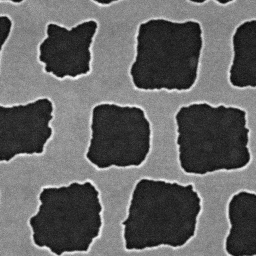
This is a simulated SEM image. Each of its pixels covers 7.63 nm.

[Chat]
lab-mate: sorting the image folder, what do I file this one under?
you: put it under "holes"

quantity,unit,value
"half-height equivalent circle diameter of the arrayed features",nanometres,569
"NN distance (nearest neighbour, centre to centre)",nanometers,701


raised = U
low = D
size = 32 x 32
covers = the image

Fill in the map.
UUUUUUUUUUUUUDUUUUUUUUUUUUUUUUUU
UUUUUUUUUUUUUUUUUUUUUUUUUUUUUUUU
DUUUUUUUUUUUUUUUUUUDDUUUUUUUUUUU
DUUUUUDDUDDDUUUUUDDDDDDDDUUUUUDD
DUUUUUDDDDDDUUUUUDDDDDDDDUUUUDDD
UUUUUDDDDDDUUUUUUDDDDDDDDUUUUDDD
UUUUUDDDDDDUUUUUUDDDDDDDDUUUUDDD
UUUUUDDDDDDUUUUUUDDDDDDDDUUUUDDD
UUUUUUDDDDDUUUUUDDDDDDDDDUUUUDDD
UUUUUUUDDDUUUUUUDDDDDDDDDUUUUDDD
UUUUUUUUUUUUUUUUUDDDDDDDUUUUUDDD
UUUUUUUUUUUUUUUUUUUUUUUUUUUUUUUU
UUUUUDUUUUUUUUUUUUUUUUUUUUUUUUUU
DDDDDDDUUUUUDDDDDUUUUUUDDDDDDDUU
DDDDDDUUUUUUDDDDDDUUUUDDDDDDDDDU
DDDDDDUUUUUDDDDDDDDUUUDDDDDDDDDU
DDDDDDDUUUUDDDDDDDDUUUDDDDDDDDDU
DDDDDDUUUUUDDDDDDDDUUUDDDDDDDDDU
DDDDDUUUUUUDDDDDDDDUUUDDDDDDDDDU
DDUUUUUUUUUDDDDDDDUUUUDDDDDDDDDU
UUUUUUUUUUUUDDDDDDUUUUUDDDDDDDDU
UUUUUUUUUUUUUUUUUUUUUUUDDDUUUUUU
UUUUUUUUUUUUUUUUUUDUUUUUUUUUUUUU
UUUUUUDDDDDDUUUUUDDDDDDDUUUUUUUU
UUUUUDDDDDDDUUUUDDDDDDDDDUUUUDDD
UUUUUDDDDDDDDUUUDDDDDDDDDUUUUDDD
UUUUUDDDDDDDDUUUDDDDDDDDDUUUDDDD
UUUUDDDDDDDDDUUUDDDDDDDDDUUUUDDD
UUUUDDDDDDDDDUUDDDDDDDDDUUUUUDDD
UUUUDDDDDDDDUUUUDDDDDDDDUUUUDDDD
UUUUDDDDDDDUUUUUDDDDDDDUUUUUDDDD
UUUUUUUDDUUUUUUUUUUUUUUUUUUUDDDD